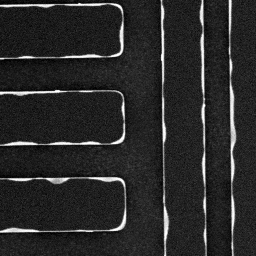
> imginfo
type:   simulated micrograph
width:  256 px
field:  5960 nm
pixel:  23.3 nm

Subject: groups of lines, slits or small figures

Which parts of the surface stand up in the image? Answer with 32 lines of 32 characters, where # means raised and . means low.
.............#......#####....###
###############.....#####....###
###############.....#####....###
###############.....#####....###
###############.....#####....###
###############.....#####....###
###############.....#####....###
....................#####....###
....................#####....###
....................#####....###
....................#####....###
......#########.....#####....###
###############.....#####....###
###############.....#####....###
###############.....#####....###
###############.....#####....###
###############......####....###
###############.....#####....###
....................######...###
....................#####....###
.....................####....###
.....................####....###
###############......#####...###
################.....#####...###
################.....#####...###
################.....#####...###
################.....#####...###
###############......#####...###
###############......#####...###
.....................#####...###
.....................#####...###
.....................#####...###